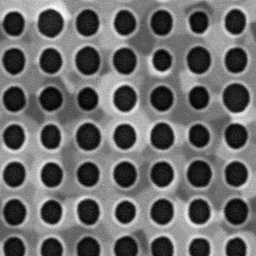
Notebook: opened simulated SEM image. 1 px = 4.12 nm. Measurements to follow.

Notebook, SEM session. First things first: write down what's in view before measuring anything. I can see a regular array of holes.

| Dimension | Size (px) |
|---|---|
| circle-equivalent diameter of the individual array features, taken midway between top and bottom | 26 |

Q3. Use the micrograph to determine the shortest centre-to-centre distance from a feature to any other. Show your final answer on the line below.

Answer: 0.151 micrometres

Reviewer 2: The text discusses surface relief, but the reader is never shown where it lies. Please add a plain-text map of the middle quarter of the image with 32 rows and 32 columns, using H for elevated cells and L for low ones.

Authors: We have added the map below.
HHHLLLLLLHHHLLLLLLHHHHLLLLLHHHHL
HHHLLLLLLHHHHLLLLLHHHHHLLLHHHHHL
HHHHLLLLHHHHHHLLLHHHHHHHHHHHHHHH
HHHHHHHHHHHHHHHHHHHHHHHHHHHHHHHH
HHHHHHHHHHHHHHHHHHHHHHHHHHHHHHHH
HHHHHHHHHHHHHHLLLHHHHHHLLHHHHHHH
HHHHLLLLHHHHHLLLLLHHHHLLLLLHHHHH
HHHHLLLLHHHHLLLLLLHHHHLLLLLLHHHL
HHHLLLLLLHHHLLLLLLHHHLLLLLLLHHHL
HHHLLLLLLHHHLLLLLLHHHHLLLLLLHHHL
HHHHLLLLHHHHLLLLLLHHHHLLLLLHHHHH
HHHHHLLHHHHHHLLLLHHHHHHLLLHHHHHH
HHHHHHHHHHHHHHHHHHHHHHHHHHHHHHHH
HHHHHHHHHHHHHHHHHHHHHHHHHHHHHHHH
HHHHHHHHHHHHHHHHHHHHHHHLLHHHHHHH
HHHHLLLLHHHHHLLLLHHHHHLLLLLHHHHH
HHHLLLLLLHHHLLLLLLHHHHLLLLLHHHHL
HHHLLLLLLHHHLLLLLLHHHLLLLLLLHHHL
HHHLLLLLLLHHLLLLLLHHHLLLLLLLHHHL
HHHLLLLLLHHHLLLLLLHHHHLLLLLLHHHL
HHHLLLLLLHHHHLLLLHHHHHLLLLLHHHHH
HHHHHLLHHHHHHHHHHHHHHHHHLHHHHHHH
HHHHHHHHHHHHHHHHHHHHHHHHHHHHHHHH
HHHHHHHHHHHHHHHHHHHHHHHHHHHHHHHH
HHHHHLLHHHHHHHLLLHHHHHHLLLHHHHHH
HHHHLLLLHHHHHLLLLLHHHHLLLLLHHHHL
HHHLLLLLLHHHLLLLLLHHHHLLLLLLHHLL
HHHLLLLLLHHHLLLLLLHHHLLLLLLLHHLL
HHHLLLLLLHHHLLLLLLHHHHLLLLLLHHHL
HHHHLLLLLHHHHLLLLLHHHHLLLLLHHHHL
HHHHHLLLHHHHHLLLLHHHHHHLLLHHHHHH
HHHHHHHHHHHHHHHHHHHHHHHHHHHHHHHH